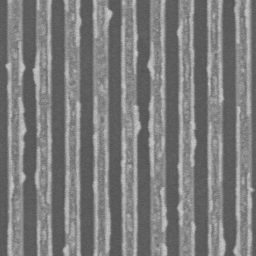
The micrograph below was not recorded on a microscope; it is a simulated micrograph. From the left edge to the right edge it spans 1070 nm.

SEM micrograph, parallel lines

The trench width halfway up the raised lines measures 59.6 nm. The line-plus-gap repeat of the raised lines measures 119 nanometers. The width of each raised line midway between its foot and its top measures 60.1 nanometers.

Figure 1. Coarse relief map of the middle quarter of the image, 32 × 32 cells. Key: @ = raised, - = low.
@@@@----@@@---@@@@---@@@@----@@@
@@@@----@@@---@@@@---@@@@----@@@
@@@@----@@@----@@@----@@@----@@@
@@@@----@@@----@@@----@@@----@@@
@@@@----@@@----@@@----@@@----@@@
-@@@----@@@---@@@@----@@@----@@@
-@@@----@@@----@@@----@@@----@@@
-@@@----@@@----@@@----@@@----@@@
-@@@----@@@----@@@----@@@----@@@
-@@@----@@@----@@@---@@@@----@@@
@@@@----@@@----@@@---@@@@----@@@
@@@@---@@@@----@@@@--@@@@----@@@
@@@@---@@@@----@@@@--@@@@----@@@
@@@@---@@@@----@@@@--@@@@----@@@
@@@@---@@@@----@@@@--@@@@----@@@
@@@@----@@@----@@@@--@@@@----@@@
@@@@----@@@----@@@@--@@@@----@@@
@@@@---@@@@----@@@---@@@@----@@@
@@@@---@@@@----@@@---@@@@----@@@
@@@@---@@@@----@@@---@@@@----@@@
@@@@---@@@@----@@@---@@@@----@@@
@@@@----@@@----@@@---@@@@----@@@
@@@@----@@@----@@@---@@@@----@@@
@@@@----@@@----@@@---@@@@----@@@
@@@@----@@@---@@@@---@@@@----@@@
@@@@----@@@---@@@@----@@@---@@@@
@@@@----@@@----@@@----@@@----@@@
@@@@----@@@---@@@@----@@@----@@@
@@@@----@@@---@@@@----@@@----@@@
@@@@---@@@@---@@@@----@@@----@@@
@@@@---@@@@----@@@----@@@----@@@
@@@@---@@@@----@@@----@@@----@@@